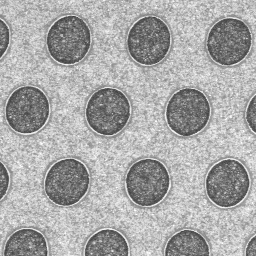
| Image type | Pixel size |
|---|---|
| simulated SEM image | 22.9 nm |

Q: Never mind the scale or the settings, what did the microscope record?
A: a regular array of holes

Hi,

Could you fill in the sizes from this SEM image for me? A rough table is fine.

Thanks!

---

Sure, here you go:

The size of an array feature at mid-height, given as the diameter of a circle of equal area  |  46.1 pixels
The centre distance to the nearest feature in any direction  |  1830 nanometres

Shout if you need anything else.